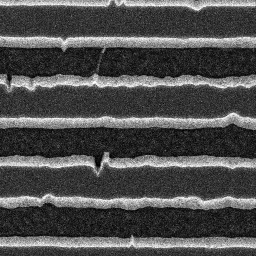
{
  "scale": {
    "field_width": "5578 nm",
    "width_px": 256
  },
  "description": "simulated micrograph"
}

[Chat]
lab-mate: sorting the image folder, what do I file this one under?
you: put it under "one or a few lines or trenches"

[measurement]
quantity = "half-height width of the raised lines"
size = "904 nm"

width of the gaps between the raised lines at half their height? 839 nm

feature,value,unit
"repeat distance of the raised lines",1740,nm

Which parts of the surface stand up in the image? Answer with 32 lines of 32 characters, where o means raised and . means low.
oooooooooooooooooooooooo.ooooooo
oooooooooooooooooooooooooooooooo
oooooooooooooooooooooooooooooooo
oooooooooooooooooooooooooooooooo
oooooooooooooooooooooooooooooooo
........o.......................
................................
................................
................................
................................
oooooooooooooooooooooooooooooooo
oooooooooooooooooooooooooooooooo
oooooooooooooooooooooooooooooooo
oooooooooooooooooooooooooooooooo
oooooooooooooooooooooooooooooooo
................................
................................
................................
................................
................................
oooooooooooo.ooooooooooooooooooo
oooooooooooooooooooooooooooooooo
oooooooooooooooooooooooooooooooo
oooooooooooooooooooooooooooooooo
oooooooooooooooooooooooooooooooo
.o..............o.......ooo...o.
................................
................................
................................
................................
oooooooooooooooooooooooooooooooo
oooooooooooooooooooooooooooooooo